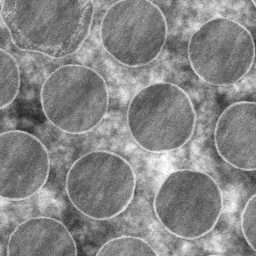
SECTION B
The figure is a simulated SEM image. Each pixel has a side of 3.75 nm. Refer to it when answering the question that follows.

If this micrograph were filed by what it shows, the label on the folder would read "raised bodies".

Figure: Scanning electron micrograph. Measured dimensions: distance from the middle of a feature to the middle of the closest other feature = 335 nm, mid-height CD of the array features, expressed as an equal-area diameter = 256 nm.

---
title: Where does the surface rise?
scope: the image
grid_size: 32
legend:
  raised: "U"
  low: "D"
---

UUUUUUUUUUUUDDUUUUUDDDDDDDDDDDDD
UUUUUUUUUUUUDUUUUUUUDDDDDDDDDDDD
UUUUUUUUUUUUDUUUUUUUUDDDDDUUUDDD
DUUUUUUUUUUDDUUUUUUUUDDDDUUUUUUD
DUUUUUUUUUUDDUUUUUUUUDDDUUUUUUUD
DDUUUUUUUUDDDUUUUUUUDDDDUUUUUUUU
UDDDDUUUUDDDDUUUUUUUDDDDUUUUUUUU
UUDDDDDDDDDDDDDUUUUDDDDDUUUUUUUU
UUDDDDDUUUUDDDDDDDDDDDDDUUUUUUUD
UUDDDDUUUUUUUDDDDDDDDDDDDUUUUUDD
UUDDDUUUUUUUUDDDDDDUUUDDDDUUUDDD
UUDDDUUUUUUUUDDDDUUUUUUDDDDDDDDD
UUDDDUUUUUUUUUDDUUUUUUUUDDDDDDDD
DDDDDUUUUUUUUDDDUUUUUUUUDDDDUUUU
DDDDDDUUUUUUUDDDUUUUUUUUDDDDUUUU
DDDDDDDUUUUUDDDDUUUUUUUUDDDUUUUU
DUUDDDDDUUUDDDDDUUUUUUUUDDDUUUUU
UUUUUDDDDDDDDDDDDUUUUUUUDDDUUUUU
UUUUUUDDDDDDDDDDDDUUUUDDDDDUUUUU
UUUUUUDDDDUUUUUDDDDDDDDDDDDDUUUU
UUUUUUDDDUUUUUUUDDDDDDDDDDDDDUUU
UUUUUUDDDUUUUUUUUDDDDDUUUDDDDDDD
UUUUUUDDUUUUUUUUUDDDDUUUUUUDDDDD
UUUUUDDDUUUUUUUUUDDDUUUUUUUDDDDD
UUUUDDDDDUUUUUUUUDDDUUUUUUUUDDDD
DDDDDDDDDUUUUUUUDDDUUUUUUUUUDDDU
DDDDDDDDDDUUUUUDDDDUUUUUUUUUDDUU
DDDUUUUDDDDDDDDDDDDDUUUUUUUDDDUU
DDUUUUUUDDDDDDDDDDDDDUUUUUUDDDUU
DUUUUUUUUDDDDDDDDDDDDDUUUDDDDDDU
DUUUUUUUUDDDDUUUUUUDDDDDDDDDDDDU
DUUUUUUUUUDDUUUUUUUDDDDDDDDDDDDD